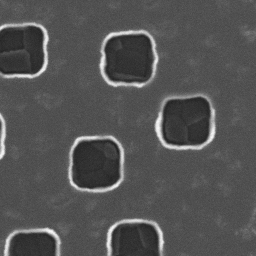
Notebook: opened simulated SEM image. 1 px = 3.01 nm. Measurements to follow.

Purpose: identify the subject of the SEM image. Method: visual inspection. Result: holes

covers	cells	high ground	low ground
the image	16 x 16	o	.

oooooooooooooooo
oooooooooooooooo
...oooo..ooooooo
...oooo...oooooo
..ooooo...oooooo
oooooooooooooooo
oooooooooo...ooo
oooooooooo...ooo
oooooooooo...ooo
ooooo..ooooooooo
ooooo...oooooooo
ooooo..ooooooooo
oooooooooooooooo
oooooooooooooooo
ooooooo...oooooo
o...ooo...oooooo